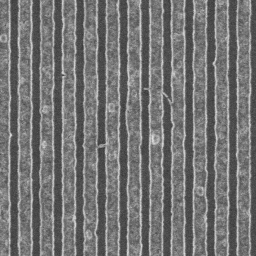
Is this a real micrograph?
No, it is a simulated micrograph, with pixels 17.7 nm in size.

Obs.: parallel lines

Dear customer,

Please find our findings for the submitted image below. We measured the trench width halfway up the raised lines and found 0.157 um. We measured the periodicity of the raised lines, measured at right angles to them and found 21.9 pixels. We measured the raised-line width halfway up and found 221 nanometers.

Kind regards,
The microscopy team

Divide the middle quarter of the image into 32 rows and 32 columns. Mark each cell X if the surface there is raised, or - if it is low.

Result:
XX---XXX---XXX--XXX--XXXX--XXX--
XX---XXX---XXX--XXX--XXXX--XXX--
XXX--XXX---XXX--XXX--XXXX--XXX--
XXX--XXX---XXX--XXX--XXXX--XXX--
XXX--XXX---XXX--XXX--XXXX--XXX--
XXX--XXX---XXX--XXX--XXXX--XXX--
XXX--XXX---XXX--XXX--XXXX--XXX--
XX---XXX---XXX--XXX--XXXX--XXX--
XXX--XXX---XXX--XXX---XXX--XXX--
XXX--XXX---XXX--XXX---XXX--XXX--
XXX--XXX---XXX--XXX--XXXX--XXX--
XXX--XXX---XXX--XXX--XXXX--XXX--
XXX--XXX---XXX--XXX--XXXX--XXX--
XXX--XXX---XXX--XXX--XXX---XXX--
XXX--XXX---XXX--XXX--XXXX--XXX--
XXX--XXX---XXX--XXX--XXXX--XXX--
XXX--XXX---XXX--XXX---XXX--XXX--
XXX--XXX---XXX--XXX---XXX--XXX--
XX---XXX---XXX--XXX---XXX--XXX--
XXX--XXX---XXX--XXX---XXX--XXX--
XXX--XXXX-XXXX--XXX--XXXX--XXX--
XXX--XXX---XXX--XXX--XXXX--XXX--
XXX--XXX---XXX--XXX--XXXX--XXX--
XXX--XXX---XX---XXX--XXXX--XXX--
XXX--XXX---XXX--XXX---XX---XXX--
XXX--XXX---XXX--XXX--XXXX--XXX--
XXX--XXX---XXX--XXX--XXXX--XXX--
XXX--XXX---XXX--XXX---XXX--XXX--
XXX--XXX---XXX--XXX---XXX--XXX--
XXX--XXX---XXX--XXX---XXX--XXX--
XXX--XXX---XXX--XXX---XXX--XXX--
XXX--XXX---XXX--XXX---XXX--XXX--